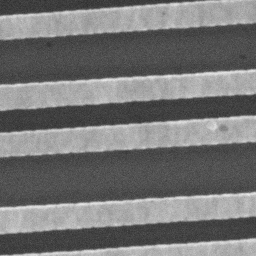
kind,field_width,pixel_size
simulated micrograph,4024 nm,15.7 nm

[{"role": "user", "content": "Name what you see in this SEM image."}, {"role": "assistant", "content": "lines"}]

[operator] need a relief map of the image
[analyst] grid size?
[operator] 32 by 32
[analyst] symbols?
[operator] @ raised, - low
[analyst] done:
---------------------@@@@@@@@@@@
--------@@@@@@@@@@@@@@@@@@@@@@@@
@@@@@@@@@@@@@@@@@@@@@@@@@@@@@@@@
@@@@@@@@@@@@@@@@@@@@@@----------
@@@@@@@-------------------------
--------------------------------
--------------------------------
--------------------------------
--------------------------------
---------------------@@@@@@@@@@@
---@@@@@@@@@@@@@@@@@@@@@@@@@@@@@
@@@@@@@@@@@@@@@@@@@@@@@@@@@@@@@@
@@@@@@@@@@@@@@@@@@@-------------
@@@@@---------------------------
--------------------------------
------------------@@@@@@@@@@@@@@
---@@@@@@@@@@@@@@@@@@@@@@@@@@@@@
@@@@@@@@@@@@@@@@@@@@@@@@@@@@@@@@
@@@@@@@@@@@@@@@@@@@-------------
@@------------------------------
--------------------------------
--------------------------------
--------------------------------
--------------------------------
--------------------------@@@@@@
----------@@@@@@@@@@@@@@@@@@@@@@
@@@@@@@@@@@@@@@@@@@@@@@@@@@@@@@@
@@@@@@@@@@@@@@@@@@@@@@@@@-------
@@@@@@@@@@@---------------------
--------------------------------
------------------------@@@@@@@@
---------@@@@@@@@@@@@@@@@@@@@@@@